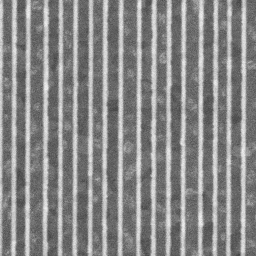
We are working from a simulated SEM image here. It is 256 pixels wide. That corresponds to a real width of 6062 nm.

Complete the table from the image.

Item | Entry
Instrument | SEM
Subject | parallel lines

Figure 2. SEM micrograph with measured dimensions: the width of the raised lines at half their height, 15 pixels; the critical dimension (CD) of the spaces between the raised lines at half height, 355 nm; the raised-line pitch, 729 nm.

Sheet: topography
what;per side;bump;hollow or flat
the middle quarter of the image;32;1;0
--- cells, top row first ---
00011110001111000001110000111100
00011110001111000001110000111100
00011110001111000001110000111100
00011110001111000001110000111100
00011110001111000001110000111100
00011110001111000001110000111100
00011110001111000001110000111100
00011110001111000001110000111100
00011100001111000001110000111100
00011100001111000001110000111100
00011100001111000001110000111100
00011100001111000001110000111100
00011100001111000001110000111100
00011100001111000001110000111100
00011100001111000001110000111100
00011100001111000001110000111100
00011100001111000001110000111100
00011100001111000001110000111100
00011100001111000001110000111100
00011100001111000001110000111100
00011100001111000001110000111100
00011100001111000001110000111100
00011100001111000001110000111100
00011100001111000001110000111100
00011100001111000001110000111100
00011100001111000001110000111100
00011100001111000001110000111100
00011100001111000001110000111100
00011100001111000001110000111100
00011100001111000001110000111100
00011100001111000001110000111100
00011100001111000001110000111100